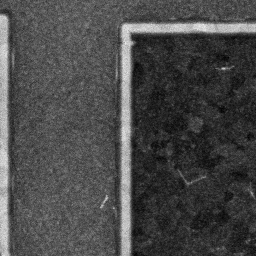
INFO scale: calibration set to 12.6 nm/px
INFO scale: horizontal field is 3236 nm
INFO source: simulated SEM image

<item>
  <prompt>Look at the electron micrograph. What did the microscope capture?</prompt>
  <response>one or a few lines or trenches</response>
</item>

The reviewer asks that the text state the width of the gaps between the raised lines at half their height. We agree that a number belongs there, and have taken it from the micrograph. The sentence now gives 1540 nm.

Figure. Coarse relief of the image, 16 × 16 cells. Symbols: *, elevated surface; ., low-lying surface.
................
................
........********
........********
........********
........********
........********
........********
........********
........********
........********
........********
........********
........********
........********
........********